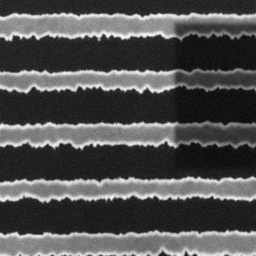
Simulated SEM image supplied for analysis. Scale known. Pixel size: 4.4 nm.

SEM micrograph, lines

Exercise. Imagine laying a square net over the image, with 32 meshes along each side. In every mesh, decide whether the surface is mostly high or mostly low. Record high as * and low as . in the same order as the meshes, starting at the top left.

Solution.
................................
................................
********************************
********************************
***********.*******.***..*..**..
................................
................................
................................
................................
********************************
********************************
................................
................................
................................
................................
......*...*.***.************.***
********************************
********************************
................................
................................
................................
................................
.............*..*.....****..****
********************************
********************************
................................
................................
................................
................................
********************************
********************************
********************.***********